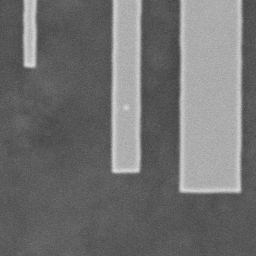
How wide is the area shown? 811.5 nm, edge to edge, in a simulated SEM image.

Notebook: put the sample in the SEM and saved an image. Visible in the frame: groups of lines, slits or small figures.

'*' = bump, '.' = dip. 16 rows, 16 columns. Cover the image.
.......**..****.
.......**..****.
.......**..****.
.......**..****.
.......**..****.
.......**..****.
.......**..****.
.......**..****.
.......**..****.
.......**..****.
.......**..****.
...........****.
................
................
................
................